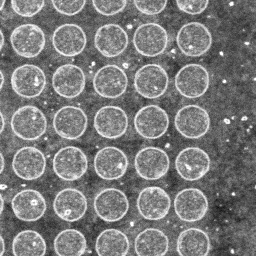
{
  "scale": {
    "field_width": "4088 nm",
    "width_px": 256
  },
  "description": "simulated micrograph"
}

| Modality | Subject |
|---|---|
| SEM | a regular array of raised bodies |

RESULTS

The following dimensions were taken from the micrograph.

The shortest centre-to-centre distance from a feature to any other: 40.4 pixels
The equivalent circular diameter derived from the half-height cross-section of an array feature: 0.496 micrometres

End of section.